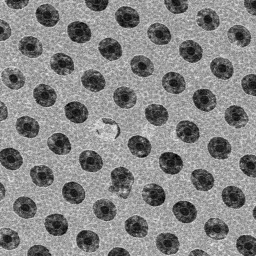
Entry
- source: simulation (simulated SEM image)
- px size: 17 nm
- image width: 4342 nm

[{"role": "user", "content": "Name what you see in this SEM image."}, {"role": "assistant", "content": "a regular array of ring-shaped grooves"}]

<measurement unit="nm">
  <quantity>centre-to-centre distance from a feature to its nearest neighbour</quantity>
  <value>602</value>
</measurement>